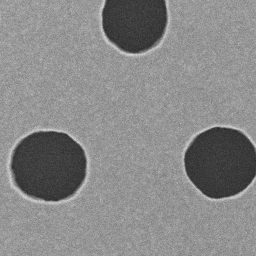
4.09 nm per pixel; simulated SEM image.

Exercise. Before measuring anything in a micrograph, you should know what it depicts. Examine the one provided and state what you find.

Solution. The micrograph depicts holes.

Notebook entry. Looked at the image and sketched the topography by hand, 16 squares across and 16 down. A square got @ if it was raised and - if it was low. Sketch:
@@@@@@----@@@@@@
@@@@@@----@@@@@@
@@@@@@@---@@@@@@
@@@@@@@@@@@@@@@@
@@@@@@@@@@@@@@@@
@@@@@@@@@@@@@@@@
@@@@@@@@@@@@@@@@
@@@@@@@@@@@@@@@@
@@--@@@@@@@@---@
@----@@@@@@@----
@----@@@@@@@----
@----@@@@@@@----
@@@-@@@@@@@@@@@@
@@@@@@@@@@@@@@@@
@@@@@@@@@@@@@@@@
@@@@@@@@@@@@@@@@